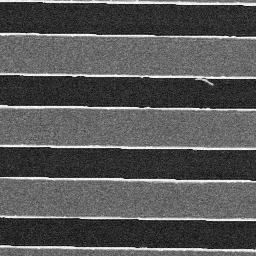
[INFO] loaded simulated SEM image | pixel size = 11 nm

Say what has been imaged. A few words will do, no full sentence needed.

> lines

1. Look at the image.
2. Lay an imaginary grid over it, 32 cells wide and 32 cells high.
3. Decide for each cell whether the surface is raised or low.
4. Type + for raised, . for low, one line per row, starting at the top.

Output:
.......................+++++++++
................................
................................
................................
+++++++++++++++++++.............
++++++++++++++++++++++++++++++++
++++++++++++++++++++++++++++++++
++++++++++++++++++++++++++++++++
++++++++++++++++++++++++++++++++
............++++++++++++++++++++
................................
................................
................................
+++++++++++++++++...............
++++++++++++++++++++++++++++++++
++++++++++++++++++++++++++++++++
++++++++++++++++++++++++++++++++
++++++++++++++++++++++++++++++++
................++++++++++++++++
................................
................................
................................
++++++++++++++++++++++..........
++++++++++++++++++++++++++++++++
++++++++++++++++++++++++++++++++
++++++++++++++++++++++++++++++++
++++++++++++++++++++++++++++++++
...........................+++++
................................
................................
................................
++++++++++++++++++++++++++++++++